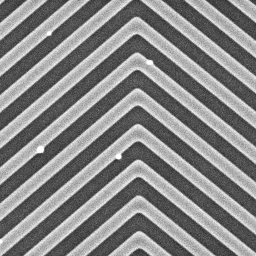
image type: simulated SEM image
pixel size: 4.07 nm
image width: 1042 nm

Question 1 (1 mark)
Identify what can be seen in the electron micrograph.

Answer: groups of lines, slits or small figures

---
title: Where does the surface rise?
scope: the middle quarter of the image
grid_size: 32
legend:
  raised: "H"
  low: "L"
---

LLLHHHHHLLLLLLHHHHHHHHHLLLLLLHHH
LLHHHHHLLLLLLHHHHHLHHHHHLLLLLLHH
LHHHHHLLLLLHHHHHLLLLHHHHHLLLLLLH
HHHHHLLLLLHHHHHLLLLLLHHHHHLLLLLL
HHHLLLLLLHHHHHLLLLLLLLLHHHHHLLLL
HHLLLLLLHHHHHLLLLLLLLLLLHHHHHLLL
HLLLLLLHHHHHLLLLLLHLLLLLLHHHHHLL
LLLLLLHHHHHLLLLLHHHHLLLLLLHHHHHH
LLLLHHHHHLLLLLLHHHHHHHLLLLLLHHHH
LLLHHHHHLLLLLLHHHHHHHHHLLLLLLHHH
LLHHHHHLLLLLLHHHHHLHHHHHLLLLLLHH
LHHHHHLLLLLHHHHHLLLLHHHHHHLLLLLH
HHHHHLLLLLHHHHHLLLLLLLHHHHHLLLLL
HHHHLLLLLHHHHHLLLLLLLLLHHHHHLLLL
HHLLLLLLHHHHHLLLLLLLLLLLHHHHHLLL
HLLLLLLHHHHHLLLLLHHLLLLLLHHHHHLL
LLLLLLHHHHHLLLLLHHHHHLLLLLHHHHHH
LLLLHHHHHLLLLLLHHHHHHHLLLLLLHHHH
LLLHHHHHLLLLLLHHHHHHHHHLLLLLLHHH
LLHHHHHLLLLLLHHHHHLHHHHHLLLLLLHH
LHHHHHLLLLLHHHHHLLLLLHHHHHLLLLLL
HHHHHLLLLLHHHHHLLLLLLLHHHHHLLLLL
HHHHLLLLLHHHHHLLLLLLLLLHHHHHLLLL
HHLLLLLLHHHHHHLLLLLLLLLLHHHHHLLL
HLLLLLLHHHHHLLLLLHHHLLLLLLHHHHHL
LLLLLLHHHHHLLLLLHHHHHLLLLLLHHHHH
LLLLHHHHHLLLLLLHHHHHHHLLLLLLHHHH
LLLHHHHHLLLLLLHHHHHHHHHLLLLLLHHH
LLHHHHHLLLLLLHHHHHLHHHHHHLLLLLHH
LHHHHHLLLLLHHHHHLLLLLHHHHHLLLLLL
HHHHHLLLLLLHHHHLLLLLLLHHHHHLLLLL
HHHHLLLLLHHHHHLLLLLLLLLHHHHHLLLL